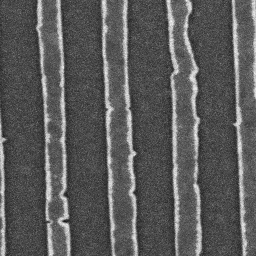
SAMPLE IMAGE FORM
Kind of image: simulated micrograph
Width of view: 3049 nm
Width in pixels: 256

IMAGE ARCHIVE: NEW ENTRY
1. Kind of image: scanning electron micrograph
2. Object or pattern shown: one or a few lines or trenches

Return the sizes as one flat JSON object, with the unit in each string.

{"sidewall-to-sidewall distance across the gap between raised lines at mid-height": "521 nm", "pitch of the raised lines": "0.774 micrometres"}